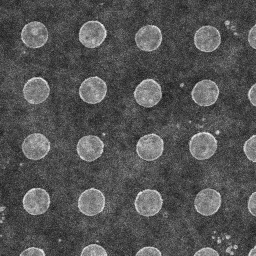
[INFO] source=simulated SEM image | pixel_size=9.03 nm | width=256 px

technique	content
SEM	a regular array of raised bodies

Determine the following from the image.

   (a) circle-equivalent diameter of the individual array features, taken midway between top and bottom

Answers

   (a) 240 nm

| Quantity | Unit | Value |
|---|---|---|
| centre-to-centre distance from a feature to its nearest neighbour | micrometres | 0.492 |